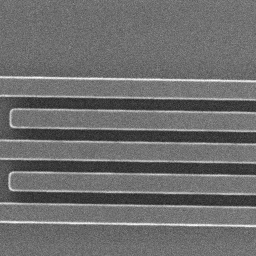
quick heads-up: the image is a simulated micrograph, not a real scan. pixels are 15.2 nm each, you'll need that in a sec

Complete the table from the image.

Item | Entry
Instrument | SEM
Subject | groups of lines, slits or small figures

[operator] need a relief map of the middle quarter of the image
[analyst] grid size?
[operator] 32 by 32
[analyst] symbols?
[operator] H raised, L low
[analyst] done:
LLLLLLLLLLLLLLLLLLLLLLLLLLLLLLLL
LLLLLLLLLLLLLLLLLLLLLLLLLLLLLLLL
LLLLLLLLLLLLLLLLLLLLLLLLLLLLLLLL
LLLLLLLLLLLLLLLLLLLLLLLLLLLLLLLL
HHHHHHHHHHHHHHHHHHHHHHHHHHHHHHHH
HHHHHHHHHHHHHHHHHHHHHHHHHHHHHHHH
HHHHHHHHHHHHHHHHHHHHHHHHHHHHHHHH
HHHHHHHHHHHHHHHHHHHHHHHHHHHHHHHH
LLLLLLLLLLLLLLLLLLHHHHHHHHHHHHHH
LLLLLLLLLLLLLLLLLLLLLLLLLLLLLLLL
LLLLLLLLLLLLLLLLLLLLLLLLLLLLLLLL
HHHHHLLLLLLLLLLLLLLLLLLLLLLLLLLL
HHHHHHHHHHHHHHHHHHHHHHHHHHHHHHHH
HHHHHHHHHHHHHHHHHHHHHHHHHHHHHHHH
HHHHHHHHHHHHHHHHHHHHHHHHHHHHHHHH
HHHHHHHHHHHHHHHHHHHHHHHHHHHHHHHH
LLLLLLLLLLLLLLLLLLLLLLLLHHHHHHHH
LLLLLLLLLLLLLLLLLLLLLLLLLLLLLLLL
LLLLLLLLLLLLLLLLLLLLLLLLLLLLLLLL
HHHHHHHHHHHLLLLLLLLLLLLLLLLLLLLL
HHHHHHHHHHHHHHHHHHHHHHHHHHHHHHHH
HHHHHHHHHHHHHHHHHHHHHHHHHHHHHHHH
HHHHHHHHHHHHHHHHHHHHHHHHHHHHHHHH
HHHHHHHHHHHHHHHHHHHHHHHHHHHHHHHH
LLLLLLLLLLLLLLLLLLLLLLLLLLLLLHHH
LLLLLLLLLLLLLLLLLLLLLLLLLLLLLLLL
LLLLLLLLLLLLLLLLLLLLLLLLLLLLLLLL
HHHHHHHHHHHHHHHHLLLLLLLLLLLLLLLL
HHHHHHHHHHHHHHHHHHHHHHHHHHHHHHHH
HHHHHHHHHHHHHHHHHHHHHHHHHHHHHHHH
HHHHHHHHHHHHHHHHHHHHHHHHHHHHHHHH
HHHHHHHHHHHHHHHHHHHHHHHHHHHHHHHH